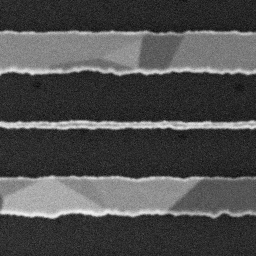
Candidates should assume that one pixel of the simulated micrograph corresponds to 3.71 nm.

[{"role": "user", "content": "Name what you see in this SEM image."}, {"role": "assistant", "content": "lines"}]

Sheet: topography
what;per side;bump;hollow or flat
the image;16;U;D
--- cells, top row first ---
DDDDDDDDDDDDDDDD
DDDDDDDDDDDDDDDD
UUUUUUUUUUUUUUUU
UUUUUUUUUUUUUUUU
DUUUDDDUUUDDDUUU
DDDDDDDDDDDDDDDD
DDDDDDDDDDDDDDDD
DDDDDDDDDDDDDDDD
DDDDDDDDDDDDDDDD
DDDDDDDDDDDDDDDD
DDDDDDDDDDDDDDDD
UUUUUUUUUUUUUUUU
UUUUUUUUUUUUUUUU
DDDUDDDDDDDDDDDD
DDDDDDDDDDDDDDDD
DDDDDDDDDDDDDDDD